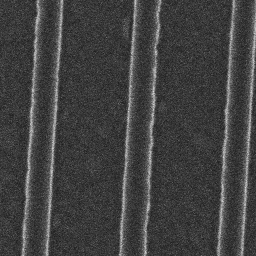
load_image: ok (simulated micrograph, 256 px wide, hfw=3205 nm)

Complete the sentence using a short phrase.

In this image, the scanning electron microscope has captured one or a few lines or trenches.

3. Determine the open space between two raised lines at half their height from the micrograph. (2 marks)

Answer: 909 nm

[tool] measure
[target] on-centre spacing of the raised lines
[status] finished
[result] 1.22 um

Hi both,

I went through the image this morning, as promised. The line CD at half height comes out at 306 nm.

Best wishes